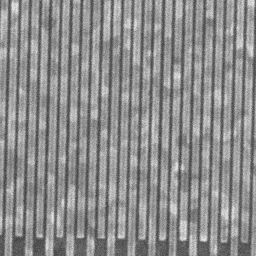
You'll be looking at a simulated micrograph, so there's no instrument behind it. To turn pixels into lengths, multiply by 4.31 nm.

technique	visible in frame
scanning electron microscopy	parallel lines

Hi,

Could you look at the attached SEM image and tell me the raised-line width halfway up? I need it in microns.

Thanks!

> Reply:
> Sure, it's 0.0253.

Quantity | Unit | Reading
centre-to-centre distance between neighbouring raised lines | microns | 0.0442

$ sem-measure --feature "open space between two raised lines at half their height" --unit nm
16.7